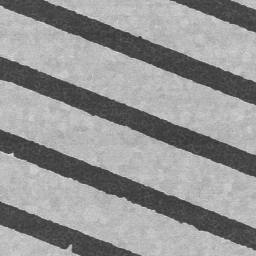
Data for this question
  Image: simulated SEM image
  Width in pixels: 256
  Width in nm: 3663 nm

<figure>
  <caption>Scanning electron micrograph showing one or a few lines or trenches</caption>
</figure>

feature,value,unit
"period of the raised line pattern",969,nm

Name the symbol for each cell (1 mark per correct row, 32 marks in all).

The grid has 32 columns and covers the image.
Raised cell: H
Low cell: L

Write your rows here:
LLLLLLLHHHHHHHHHHHHHHHLLLLLLLLHH
HHLLLLLLLHHHHHHHHHHHHHHHHLLLLLLL
HHHHLLLLLLLLHHHHHHHHHHHHHHHLLLLL
HHHHHHHLLLLLLLLHHHHHHHHHHHHHHHLL
HHHHHHHHHHLLLLLLLHHHHHHHHHHHHHHH
HHHHHHHHHHHHLLLLLLLLHHHHHHHHHHHH
HHHHHHHHHHHHHHHLLLLLLLHHHHHHHHHH
LHHHHHHHHHHHHHHHHLLLLLLLLHHHHHHH
LLLLHHHHHHHHHHHHHHHHLLLLLLLHHHHH
LLLLLLLHHHHHHHHHHHHHHHLLLLLLLLHH
HHLLLLLLLHHHHHHHHHHHHHHHHLLLLLLL
HHHHLLLLLLLLHHHHHHHHHHHHHHHHLLLL
HHHHHHHLLLLLLLHHHHHHHHHHHHHHHHLL
HHHHHHHHHLLLLLLLLHHHHHHHHHHHHHHH
HHHHHHHHHHHHLLLLLLLHHHHHHHHHHHHH
HHHHHHHHHHHHHHHLLLLLLLHHHHHHHHHH
LHHHHHHHHHHHHHHHHLLLLLLLLHHHHHHH
LLLLHHHHHHHHHHHHHHHHLLLLLLLHHHHH
LLLLLLHHHHHHHHHHHHHHHHLLLLLLLLHH
HHLLLLLLLHHHHHHHHHHHHHHHHLLLLLLL
HHHHLLLLLLLHHHHHHHHHHHHHHHHLLLLL
HHHHHHLLLLLLLLHHHHHHHHHHHHHHHHLL
HHHHHHHHHLLLLLLLLHHHHHHHHHHHHHHH
HHHHHHHHHHHHLLLLLLLHHHHHHHHHHHHH
HHHHHHHHHHHHHHLLLLLLLLHHHHHHHHHH
LHHHHHHHHHHHHHHHHLLLLLLLHHHHHHHH
LLLLHHHHHHHHHHHHHHHLLLLLLLLHHHHH
LLLLLLHHHHHHHHHHHHHHHHLLLLLLLHHH
HLLLLLLLLHHHHHHHHHHHHHHHLLLLLLLL
HHHHLLLLLLLHHHHHHHHHHHHHHHHLLLLL
HHHHHHLLLLLLLLHHHHHHHHHHHHHHHHLL
HHHHHHHHHLLLLLLLLHHHHHHHHHHHHHHH